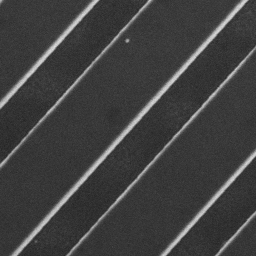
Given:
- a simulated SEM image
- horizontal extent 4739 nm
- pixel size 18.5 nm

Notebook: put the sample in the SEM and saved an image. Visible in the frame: lines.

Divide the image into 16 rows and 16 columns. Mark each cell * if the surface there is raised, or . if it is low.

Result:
******...******.
*****...******..
****...******...
***...******...*
**...******....*
*...******....**
...*******...***
...******...****
..******...*****
.******...******
******...******.
*****...******..
****...******...
***...******....
**...*******...*
*....******...**